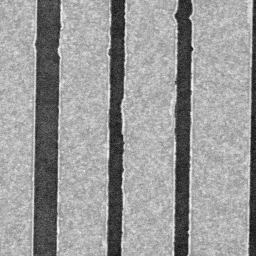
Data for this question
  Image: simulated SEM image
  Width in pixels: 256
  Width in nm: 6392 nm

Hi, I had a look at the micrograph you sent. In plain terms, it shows one or a few lines or trenches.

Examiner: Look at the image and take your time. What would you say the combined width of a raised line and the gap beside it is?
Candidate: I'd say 1710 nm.